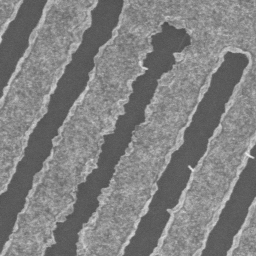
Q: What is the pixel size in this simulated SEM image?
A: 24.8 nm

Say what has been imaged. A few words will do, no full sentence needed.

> one or a few lines or trenches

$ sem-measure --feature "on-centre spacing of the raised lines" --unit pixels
68.1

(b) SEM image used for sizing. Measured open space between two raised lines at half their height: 681 nanometres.